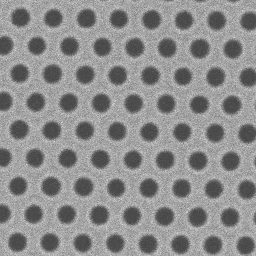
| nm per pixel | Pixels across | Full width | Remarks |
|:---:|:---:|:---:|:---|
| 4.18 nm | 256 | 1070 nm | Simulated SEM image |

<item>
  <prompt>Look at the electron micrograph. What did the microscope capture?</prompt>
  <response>a regular array of holes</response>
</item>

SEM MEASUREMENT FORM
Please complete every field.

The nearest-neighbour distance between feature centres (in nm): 134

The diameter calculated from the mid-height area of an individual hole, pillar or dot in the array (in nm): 76.5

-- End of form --